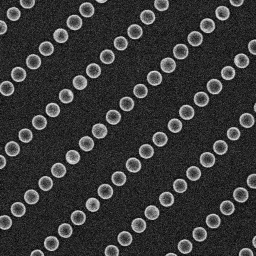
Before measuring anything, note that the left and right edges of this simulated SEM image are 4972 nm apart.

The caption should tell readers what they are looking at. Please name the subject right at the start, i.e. a regular array of raised bodies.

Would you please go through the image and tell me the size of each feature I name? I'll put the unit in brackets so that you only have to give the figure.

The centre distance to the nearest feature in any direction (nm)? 356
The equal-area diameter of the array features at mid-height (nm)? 275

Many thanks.